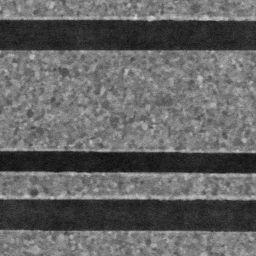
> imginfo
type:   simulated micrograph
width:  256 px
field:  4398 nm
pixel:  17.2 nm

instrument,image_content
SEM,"lines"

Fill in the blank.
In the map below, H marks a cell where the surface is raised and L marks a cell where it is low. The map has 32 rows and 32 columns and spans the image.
HHHHHHHHHHHHHHHHHHHHHHHHHHHHHHHH
HHHHHHHHHHHHHHHHHHHHHHHHHHHHHHHH
LLLLLLLLLLLLLLLLLLHLLLLLLLLLLLLL
LLLLLLLLLLLLLLLLLLLLLLLLLLLLLLLL
LLLLLLLLLLLLLLLLLLLLLLLLLLLLLLLL
LLLLLLLLLLLLLLLLLLLLLLLLLLLLLLLL
HHHHHHHHHHHHHHHHHHHHHHHHHHHHHHHH
HHHHHHHHHHHHHHHHHHHHHHHHHHHHHHHH
HHHHHHHHHHHHHHHHHHHHHHHHHHHHHHHH
HHHHHHHHHHHHHHHHHHHHHHHHHHHHHHHH
HHHHHHHHHHHHHHHHHHHHHHHHHHHHHHHH
HHHHHHHHHHHHHHHHHHHHHHHHHHHHHHHH
HHHHHHHHHHHHHHHHHHHHHHHHHHHHHHHH
HHHHHHHHHHHHHHHHHHHHHHHHHHHHHHHH
HHHHHHHHHHHHHHHHHHHHHHHHHHHHHHHH
HHHHHHHHHHHHHHHHHHHHHHHHHHHHHHHH
HHHHHHHHHHHHHHHHHHHHHHHHHHHHHHHH
HHHHHHHHHHHHHHHHHHHHHHHHHHHHHHHH
HHHHHHHHHHHHHHHHHHHHHHHHHHHHHHHH
LLLLLLLLLLLLLLLLLLLLLLLLLLLLLLLL
LLLLLLLLLLLLLLLLLLLLLLLLLLLLLLLL
LLLLLLLLLLLLLLLLLLLLLLLLLLLLLLLL
HHHHHHHHHHHHHHHHHHHHHHHHHHHHHHHH
HHHHHHHHHHHHHHHHHHHHHHHHHHHHHHHH
HHHHHHHHHHHHHHHHHHHHHHHHHHHHHHHH
LLLLLLLLLLLLLLLLLLLLLLLLLLLLLLLL
LLLLLLLLLLLLLLLLLLLLLLLLLLLLLLLL
LLLLLLLLLLLLLLLLLLLLLLLLLLLLLLLL
LLLLLLLLLLLLLLLLLLLLLLLLLLLLLLLL
HHHHHHHHHHHHHHHHHHHHHHHHHHHHHHHH
HHHHHHHHHHHHHHHHHHHHHHHHHHHHHHHH
HHHHHHHHHHHHHHHHHHHHHHHHHHHHHHHH